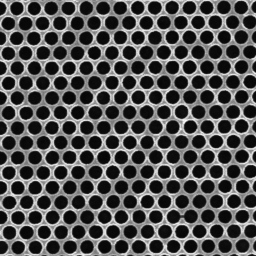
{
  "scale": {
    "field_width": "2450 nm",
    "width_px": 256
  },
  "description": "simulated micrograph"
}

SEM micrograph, a regular array of holes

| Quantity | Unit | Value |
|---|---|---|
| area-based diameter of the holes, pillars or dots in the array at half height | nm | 134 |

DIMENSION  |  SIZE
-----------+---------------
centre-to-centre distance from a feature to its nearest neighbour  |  161 nanometres